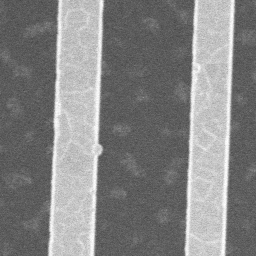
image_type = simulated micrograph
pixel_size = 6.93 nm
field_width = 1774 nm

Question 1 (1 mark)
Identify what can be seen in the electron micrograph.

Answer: one or a few lines or trenches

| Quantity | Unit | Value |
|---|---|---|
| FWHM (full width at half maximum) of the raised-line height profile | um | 0.269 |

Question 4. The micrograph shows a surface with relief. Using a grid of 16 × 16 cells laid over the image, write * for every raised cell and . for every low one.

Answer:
....**......**..
....**......**..
....**......**..
....**......**..
....**......**..
....**......**..
....**......**..
...***......**..
...***......**..
...***......**..
...***......**..
...***......**..
...***......**..
...***......**..
...***......**..
...***......**..